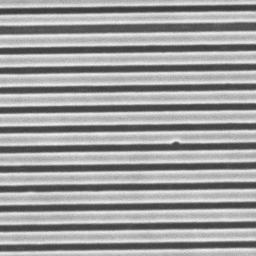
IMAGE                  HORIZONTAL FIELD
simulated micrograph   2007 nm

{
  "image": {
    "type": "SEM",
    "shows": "parallel lines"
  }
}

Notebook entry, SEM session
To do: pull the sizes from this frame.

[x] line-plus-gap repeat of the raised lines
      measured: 0.155 microns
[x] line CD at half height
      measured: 0.101 micrometres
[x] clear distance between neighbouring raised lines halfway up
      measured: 53.9 nanometres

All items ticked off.